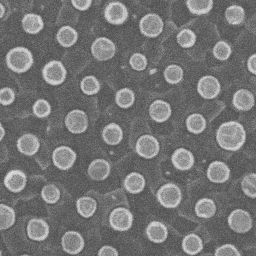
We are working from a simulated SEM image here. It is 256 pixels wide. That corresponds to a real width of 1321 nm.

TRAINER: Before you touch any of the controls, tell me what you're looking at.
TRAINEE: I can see a regular array of raised bodies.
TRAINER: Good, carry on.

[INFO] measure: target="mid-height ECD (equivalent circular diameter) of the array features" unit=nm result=111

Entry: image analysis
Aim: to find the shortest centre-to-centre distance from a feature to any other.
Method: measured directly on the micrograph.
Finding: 192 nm